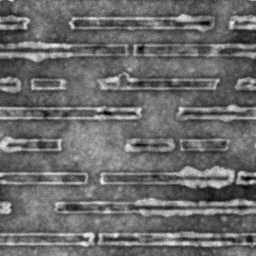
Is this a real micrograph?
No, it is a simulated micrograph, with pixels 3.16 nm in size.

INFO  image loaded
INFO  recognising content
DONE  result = parallel lines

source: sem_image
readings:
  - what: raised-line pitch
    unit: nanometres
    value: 97.9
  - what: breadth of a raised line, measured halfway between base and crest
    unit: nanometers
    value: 33.1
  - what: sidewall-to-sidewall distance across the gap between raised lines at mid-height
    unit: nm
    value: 63.5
